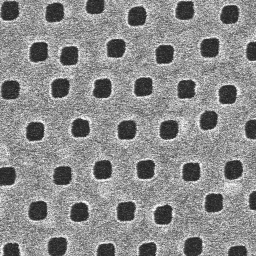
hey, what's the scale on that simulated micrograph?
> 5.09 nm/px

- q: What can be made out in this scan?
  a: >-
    a regular array of holes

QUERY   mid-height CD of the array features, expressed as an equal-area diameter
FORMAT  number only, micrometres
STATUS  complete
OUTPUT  0.104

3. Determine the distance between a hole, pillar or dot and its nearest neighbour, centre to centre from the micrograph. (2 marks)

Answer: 197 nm